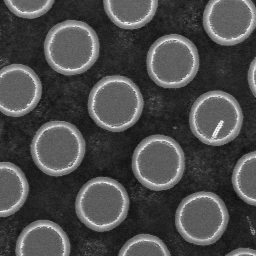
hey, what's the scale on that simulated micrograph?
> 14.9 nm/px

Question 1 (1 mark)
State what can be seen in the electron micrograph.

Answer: a regular array of raised bodies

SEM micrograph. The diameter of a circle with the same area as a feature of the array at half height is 736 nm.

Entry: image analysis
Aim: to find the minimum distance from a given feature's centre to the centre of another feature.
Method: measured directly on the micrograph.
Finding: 1060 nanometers